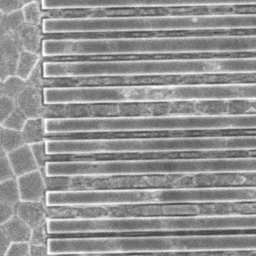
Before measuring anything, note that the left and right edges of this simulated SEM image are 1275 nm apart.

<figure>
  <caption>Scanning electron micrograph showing parallel lines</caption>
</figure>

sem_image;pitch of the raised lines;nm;122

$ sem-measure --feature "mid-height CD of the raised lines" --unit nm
69.1